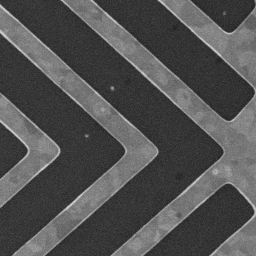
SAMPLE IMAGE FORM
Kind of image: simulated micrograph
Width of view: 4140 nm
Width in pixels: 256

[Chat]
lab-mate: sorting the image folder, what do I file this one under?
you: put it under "groups of lines, slits or small figures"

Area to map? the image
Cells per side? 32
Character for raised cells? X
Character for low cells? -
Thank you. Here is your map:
--------XXXX--------XXXX--------
X--------XXXX--------XXXX-------
XX--------XXXX--------XXXX-----X
XXX--------XXXX---------XXX---XX
XXXX---------XXX---------XXXXXXX
--XXX---------XXX---------XXXXXX
---XXX---------XXXX--------XXXXX
----XXXX--------XXXX--------XXXX
-----XXXX--------XXXX--------XXX
------XXXX--------XXXX--------XX
-------XXXX--------XXXX--------X
--------XXXX--------XXXX--------
X--------XXXX--------XXXX------X
XX--------XXXX--------XXXX-----X
XXX--------XXXX--------XXXX---XX
XXXX--------XXXX---------XXXXXXX
-XXXX---------XXX---------XXXXXX
---XXX---------XXX---------XXXXX
---XXXX--------XXXX---------XXXX
---XXXX--------XXXX---------XXXX
--XXXX--------XXXX---------XXXXX
-XXXX--------XXXX---------XXXXXX
XXXX--------XXXX---------XXXXXXX
XXX--------XXXX---------XXX--XXX
XX--------XXXX--------XXXX----XX
---------XXXX--------XXXX------X
--------XXXX--------XXXX--------
-------XXXX--------XXXX--------X
-----XXXX---------XXXX--------XX
----XXXX---------XXXX--------XXX
---XXXX---------XXXX--------XXXX
--XXXX--------XXXX---------XXXXX